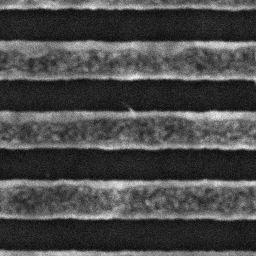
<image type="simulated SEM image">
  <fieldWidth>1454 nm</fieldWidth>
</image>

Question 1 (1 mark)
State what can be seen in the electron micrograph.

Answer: lines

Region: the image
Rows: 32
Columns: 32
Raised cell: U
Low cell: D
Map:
UUUUUUUUUUUUUUUUUUUUUUUUUUUUUUUU
DDDDDDDDDDDDDDDDDDDDDDDDDDDDDDDD
DDDDDDDDDDDDDDDDDDDDDDDDDDDDDDDD
DDDDDDDDDDDDDDDDDDDDDDDDDDDDDDDD
DDDDDDDDDDDDDDDDDDDDDDDDDDDDDDDD
DDDDDDDDDDDDDDDDDDDDDDDDUDDDDDDU
UUUUUUUUUUUUUUUUUUUUUUUUUUUUUUUU
UUUUUUUUUUUUUUUUUUUUUUUUUUUUUUUU
UUUUUUUUUUUUUUUUUUUUUUUUUUUUUUUU
UUUUUUUUUUUUUUUUUUUUUUUUUUUUUUUU
DDDDDDDDDDDDDDDDDDDDDDDDDDDDDDDD
DDDDDDDDDDDDDDDDDDDDDDDDDDDDDDDD
DDDDDDDDDDDDDDDDDDDDDDDDDDDDDDDD
DDDDDDDDDDDDDDDDDDDDDDDDDDDDDDDD
UDDUUUUUUUUUUUUUUUUUUUUUUUUUUUUU
UUUUUUUUUUUUUUUUUUUUUUUUUUUUUUUU
UUUUUUUUUUUUUUUUUUUUUUUUUUUUUUUU
UUUUUUUUUUUUUUUUUUUUUUUUUUUUUUUU
DUDUDDDDDDDDDUDDDDUUUDDDDDUUUUUU
DDDDDDDDDDDDDDDDDDDDDDDDDDDDDDDD
DDDDDDDDDDDDDDDDDDDDDDDDDDDDDDDD
DDDDDDDDDDDDDDDDDDDDDDDDDDDDDDDD
DDDDDDDDDDDDDDDDDDDDDDDDDDDDDDDD
UUUUUUUUUUUUUUUUUUUUUUUUUUUUUUUU
UUUUUUUUUUUUUUUUUUUUUUUUUUUUUUUU
UUUUUUUUUUUUUUUUUUUUUUUUUUUUUUUU
UUUUUUUUUUUUUUUUUUUUUUUUUUUUUUUU
DDDDDDDDDDDDDDDDDDDDDDDDDDDDDDDD
DDDDDDDDDDDDDDDDDDDDDDDDDDDDDDDD
DDDDDDDDDDDDDDDDDDDDDDDDDDDDDDDD
DDDDDDDDDDDDDDDDDDDDDDDDDDDDDDDD
DDDDDDDDDDDDDDDDDDDDDDDDDDDDDDDD